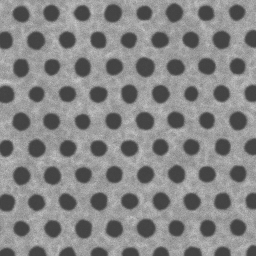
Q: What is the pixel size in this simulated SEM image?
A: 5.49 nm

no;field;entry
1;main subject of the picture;a regular array of holes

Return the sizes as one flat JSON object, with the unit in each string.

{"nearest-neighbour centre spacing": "167 nanometres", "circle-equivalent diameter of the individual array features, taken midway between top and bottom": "91.5 nm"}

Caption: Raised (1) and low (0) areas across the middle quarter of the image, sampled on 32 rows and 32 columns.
11100001110000011100000111000011
11100001111000011100000111000011
11100011111000111110001111100111
11111111111111111111111111111111
11111111111111111111111111111111
01111111111111100111111001111111
00011110000111000011110000111100
00011100000111000011110000111100
00011110000111100011110000111100
11111111011111100111111001111111
11111111111111111111111111111111
11111111111111111111111111111111
11110111111000111110011111000111
11100011110000111100001111000011
11100001110000111100000111000011
11100011111000111100001111100011
11111111111111111111011111111111
11111111111111111111111111111111
11111111111111111111111111111111
00111110001111100011110001111100
00011110000111000011110000111100
00011110000111000011110000111100
00111110001111100011111001111110
11111111111111111111111111111111
11111111111111111111111111111111
11111111111111111111111111100111
11100001111000111110001111000011
11100001110000011100001111000011
11100001111000011100001111000011
11110011111000111110011111100111
11111111111111111111111111111111
11111111111111111111111111111111